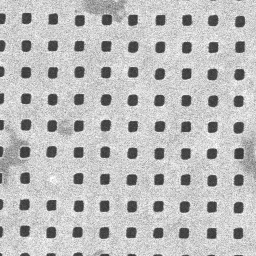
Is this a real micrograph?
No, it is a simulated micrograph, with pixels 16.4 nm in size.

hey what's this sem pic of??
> a regular array of holes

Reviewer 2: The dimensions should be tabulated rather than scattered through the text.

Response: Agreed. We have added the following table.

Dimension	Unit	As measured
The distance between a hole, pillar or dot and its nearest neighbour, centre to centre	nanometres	426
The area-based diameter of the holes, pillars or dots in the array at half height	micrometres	0.193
